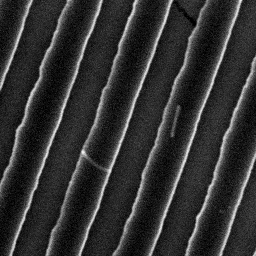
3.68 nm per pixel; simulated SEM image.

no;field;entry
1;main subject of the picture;lines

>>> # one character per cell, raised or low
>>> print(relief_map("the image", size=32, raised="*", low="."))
****....*****....****.....****..
****....****.....****....*****..
***....*****....*****....****...
***....*****....****.....****...
***....****....*****....*****...
**....*****....*****....****....
**....****.....****....*****....
*....*****....*****....*****....
*....*****....*****....****.....
*....****.....****....*****....*
.....****....*****....*****....*
....*****....****....*****....**
....****.....****....*****....**
...*****....*****....****.....**
...*****....****.....****....***
...****.....****....*****....***
..*****....*****....****....****
..*****....****.....****....****
..****....*****....*****....****
.*****....*****....****.....****
.****.....****....*****....*****
.****....*****....*****....****.
*****....****.....****.....****.
****.....****....*****....*****.
****....*****....*****....****..
****....****.....****.....****..
***.....****....*****....****...
***....*****....****.....****...
***....****.....****....*****...
**....*****....*****....*****...
**....*****....****.....****....
**....****....*****....*****....